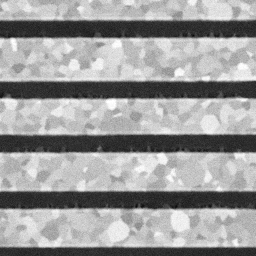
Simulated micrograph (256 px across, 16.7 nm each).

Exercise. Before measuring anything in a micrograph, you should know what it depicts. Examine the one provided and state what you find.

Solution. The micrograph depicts lines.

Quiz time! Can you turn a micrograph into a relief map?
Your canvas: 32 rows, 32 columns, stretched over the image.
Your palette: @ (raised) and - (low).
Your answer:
@@@@@@@@@@@@@@@@@@@@@@@@@@@@@@@@
@@@@@@@@@@@@@@@@@@@@@@@@@@@@@@@@
@@@@@@@@@@@@@@@@@@@@@@@@@@@@@@@@
--------------------------------
--------------------------------
@@@@@@@@@@@@@@@@@@@@@@@@@@@@@@@@
@@@@@@@@@@@@@@@@@@@@@@@@@@@@@@@@
@@@@@@@@@@@@@@@@@@@@@@@@@@@@@@@@
@@@@@@@@@@@@@@@@@@@@@@@@@@@@@@@@
@@@@@@@@@@@@@@@@@@@@@@@@@@@@@@@@
--------------------------------
--------------------------------
@@@@@@@@@@@@@@@@@@@@@@@@@@@@@@@@
@@@@@@@@@@@@@@@@@@@@@@@@@@@@@@@@
@@@@@@@@@@@@@@@@@@@@@@@@@@@@@@@@
@@@@@@@@@@@@@@@@@@@@@@@@@@@@@@@@
@@@@@@@@@@@@@@@@@@@@@@@@@@@@@@@@
--------------------------------
--------------------------------
@@@@@@@@@@@@@@@@@@@@@@@@@@@@@@@@
@@@@@@@@@@@@@@@@@@@@@@@@@@@@@@@@
@@@@@@@@@@@@@@@@@@@@@@@@@@@@@@@@
@@@@@@@@@@@@@@@@@@@@@@@@@@@@@@@@
@@@@@@@@@@@@@@@@@@@@@@@@@@@@@@@@
--------------------------------
--------------------------------
@@@@@@@@@@@@@@@@@@@@@@@@@@@@@@@@
@@@@@@@@@@@@@@@@@@@@@@@@@@@@@@@@
@@@@@@@@@@@@@@@@@@@@@@@@@@@@@@@@
@@@@@@@@@@@@@@@@@@@@@@@@@@@@@@@@
@@@@@@@@@@@@@@@@@@@@@@@@@@@@@@@@
--------------------------------